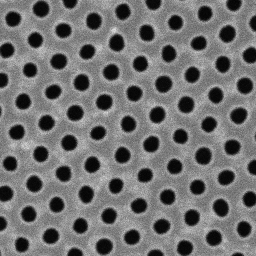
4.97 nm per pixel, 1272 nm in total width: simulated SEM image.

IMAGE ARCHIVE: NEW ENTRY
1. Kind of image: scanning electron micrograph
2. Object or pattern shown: a regular array of holes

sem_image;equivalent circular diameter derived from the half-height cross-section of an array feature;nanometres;80.1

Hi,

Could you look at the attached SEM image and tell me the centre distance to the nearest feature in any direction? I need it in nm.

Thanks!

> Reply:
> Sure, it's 150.